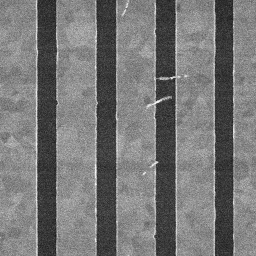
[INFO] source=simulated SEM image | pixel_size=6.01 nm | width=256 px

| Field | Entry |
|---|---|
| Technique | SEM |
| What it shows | parallel lines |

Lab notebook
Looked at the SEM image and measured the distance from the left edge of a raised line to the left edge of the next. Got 357 nanometers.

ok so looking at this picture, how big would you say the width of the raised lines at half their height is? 233 nm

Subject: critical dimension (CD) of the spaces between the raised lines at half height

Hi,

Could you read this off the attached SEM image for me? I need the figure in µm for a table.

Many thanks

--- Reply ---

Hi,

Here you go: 0.119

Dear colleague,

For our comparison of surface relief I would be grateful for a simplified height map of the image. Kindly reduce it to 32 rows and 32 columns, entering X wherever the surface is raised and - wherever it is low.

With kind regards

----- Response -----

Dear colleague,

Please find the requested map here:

XXXXX--XXXXX---XXXX---XXXXX--XXX
XXXXX--XXXXX---XXXX---XXXXX--XXX
XXXXX--XXXXX---XXXX---XXXXX--XXX
XXXXX--XXXXX---XXXX---XXXXX--XXX
XXXXX--XXXXX---XXXX---XXXXX--XXX
XXXXX--XXXXX---XXXX---XXXXX--XXX
XXXXX--XXXXX---XXXX---XXXXX--XXX
XXXXX--XXXXX---XXXX---XXXXX--XXX
XXXXX--XXXXX---XXXX---XXXXX--XXX
XXXXX--XXXXX---XXXX---XXXXX--XXX
XXXXX--XXXXX---XXXX---XXXXX--XXX
XXXXX--XXXXX---XXXX---XXXXX--XXX
XXXXX--XXXXX---XXXXX--XXXXX--XXX
XXXXX--XXXXX---XXXX---XXXXX--XXX
XXXXX--XXXXX---XXXX---XXXXX--XXX
XXXXX--XXXXX---XXXX---XXXXX--XXX
XXXXX--XXXXX---XXXX---XXXXX--XXX
XXXXX--XXXXX---XXXX---XXXXX--XXX
XXXXX--XXXXX---XXXX---XXXXX--XXX
XXXXX--XXXXX---XXXX---XXXXX--XXX
XXXXX--XXXXX---XXXX---XXXXX--XXX
XXXXX--XXXXX---XXXX---XXXXX--XXX
XXXXX--XXXXX---XXXX---XXXXX--XXX
XXXXX--XXXXX---XXXX---XXXXX--XXX
XXXXX--XXXXX---XXXX---XXXXX--XXX
XXXXX--XXXXX---XXXX---XXXXX--XXX
XXXXX--XXXXX---XXXX---XXXXX--XXX
XXXXX--XXXXX---XXXX---XXXXX--XXX
XXXXX--XXXXX---XXXX---XXXXX--XXX
XXXXX--XXXXX---XXXX---XXXXX--XXX
XXXXX--XXXXX---XXXX---XXXXX--XXX
XXXXX--XXXXX---XXXX---XXXXX--XXX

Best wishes